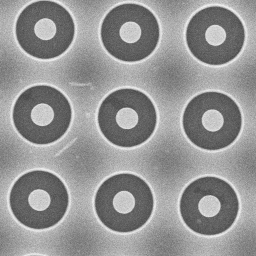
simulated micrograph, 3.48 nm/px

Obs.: an array of small figures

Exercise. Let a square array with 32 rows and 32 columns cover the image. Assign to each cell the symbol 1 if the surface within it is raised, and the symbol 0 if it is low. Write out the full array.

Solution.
11110001111111100111111111111111
11100000011111000001111110000111
11000100011110000000111100000011
11001110011110011000111000110001
11000110011110011100111000110001
11000000011110000000111000100011
11100000111110000001111100000011
11111111111111100011111110000111
11111111111111111111111111111111
11111111111111111111111111111111
11111111111111111111111111111111
11100000111111000011111111011111
11000000011110000001111100000111
11001100011100000001111000000011
11001110011100011000111001110011
11000100011100011000111001110011
11000000111110000001111000000011
11100001111110000011111100000111
11111111111111101111111110001111
11111111111111111111111111111111
11111111111111111111111111111111
11100011111111111111111111111111
11000000111110000011111100001111
10000000111100000001111000000111
10001100011100111001111000100011
10001100011100111001110001100011
10000000111100010001110001100011
11000000111100000001111000000111
11100011111110000011111000000111
11111111111111111111111111111111
11111111111111111111111111111111
11111111111111111111111111111111